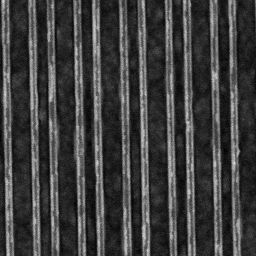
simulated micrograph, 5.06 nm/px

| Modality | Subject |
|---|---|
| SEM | parallel lines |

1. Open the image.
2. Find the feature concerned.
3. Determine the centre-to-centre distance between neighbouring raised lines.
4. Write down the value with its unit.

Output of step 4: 22.7 px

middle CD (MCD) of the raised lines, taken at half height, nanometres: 32.3